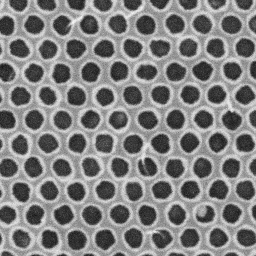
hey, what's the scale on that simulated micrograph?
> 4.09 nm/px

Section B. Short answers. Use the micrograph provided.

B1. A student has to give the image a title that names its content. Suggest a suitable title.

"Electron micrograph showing a regular array of holes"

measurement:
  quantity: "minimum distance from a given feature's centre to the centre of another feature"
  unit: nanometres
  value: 110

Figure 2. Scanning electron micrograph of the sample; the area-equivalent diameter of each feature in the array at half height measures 84.2 nm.